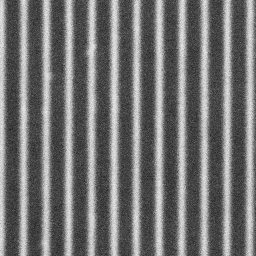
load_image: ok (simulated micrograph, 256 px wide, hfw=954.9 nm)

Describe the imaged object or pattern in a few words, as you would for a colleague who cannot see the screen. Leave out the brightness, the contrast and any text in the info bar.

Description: parallel lines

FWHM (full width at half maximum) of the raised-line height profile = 19.1 nanometers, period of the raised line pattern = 84.5 nanometers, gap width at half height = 64.4 nm